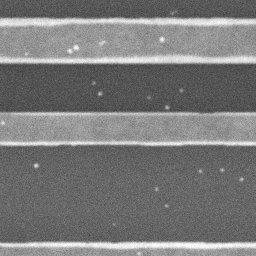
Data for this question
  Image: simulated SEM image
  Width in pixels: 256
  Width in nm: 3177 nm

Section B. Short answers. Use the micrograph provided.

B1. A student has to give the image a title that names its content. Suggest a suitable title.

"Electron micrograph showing lines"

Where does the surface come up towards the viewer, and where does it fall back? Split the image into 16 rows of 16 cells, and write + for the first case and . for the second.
................
++++++++++++++++
++++++++++++++++
++++++++++++++++
................
................
................
++++++++++++++++
++++++++++++++++
................
................
................
................
................
................
++++++++++++++++